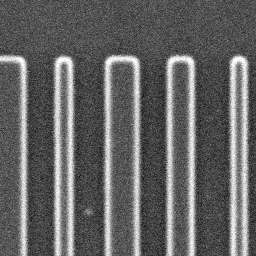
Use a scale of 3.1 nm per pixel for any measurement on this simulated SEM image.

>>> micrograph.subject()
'groups of lines, slits or small figures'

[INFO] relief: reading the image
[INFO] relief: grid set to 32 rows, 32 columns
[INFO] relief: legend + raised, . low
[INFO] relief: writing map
................................
................................
................................
................................
................................
................................
................................
+++...........+++....+++.....+..
+++....++....++++....+++.....++.
+++....++....++++....+++.....++.
+++....++....++++....+++.....++.
+++....++....++++....+++.....++.
+++....++....++++....+++.....++.
+++....++....++++....+++.....++.
+++....++....++++....+++.....++.
+++....++....++++....+++.....++.
+++....++....++++....+++.....++.
+++....++....++++....+++.....++.
+++....++....++++....+++.....++.
+++....++....++++....+++.....++.
+++....++....++++....+++.....++.
+++....++....++++....+++.....++.
+++....++....++++....+++.....++.
+++....++....++++....+++.....++.
+++....++....++++....+++.....++.
+++....++....++++....+++.....++.
+++....++....++++....+++.....++.
+++....++....++++....+++.....++.
+++....++....++++....+++.....++.
+++....++....++++....+++.....++.
+++....++....++++....+++.....++.
+++....++....++++....+++.....++.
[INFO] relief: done